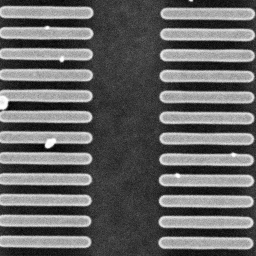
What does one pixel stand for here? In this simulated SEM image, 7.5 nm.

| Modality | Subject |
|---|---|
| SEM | groups of lines, slits or small figures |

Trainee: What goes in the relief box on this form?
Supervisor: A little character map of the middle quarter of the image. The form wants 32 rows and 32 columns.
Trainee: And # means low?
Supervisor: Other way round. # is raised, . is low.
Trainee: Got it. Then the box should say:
................................
######..........................
#######.................########
#######.................########
................................
................................
................................
#######.................########
#######.................########
.........................#######
................................
................................
#######.................########
#######.................########
######...................#######
................................
................................
######...................#######
#######.................########
######..................########
................................
................................
######..........................
#######.................########
#######.................########
................................
................................
................................
#######.................########
#######.................########
................................
................................